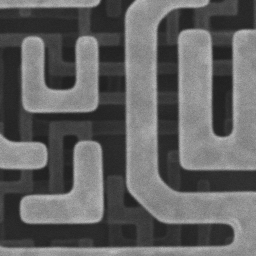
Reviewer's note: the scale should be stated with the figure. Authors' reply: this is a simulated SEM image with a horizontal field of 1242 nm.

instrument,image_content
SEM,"wiring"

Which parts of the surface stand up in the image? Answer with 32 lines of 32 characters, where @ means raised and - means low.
@@@@@@@@@@@@-----@@@@@@@@@------
----------------@@@@@-----------
----------------@@@@------------
----------------@@@@------------
----------------@@@@--@@@@---@@@
---@@-----@@----@@@@--@@@@---@@@
---@@----@@@----@@@@--@@@@---@@@
---@@-----@@----@@@@--@@@@---@@@
---@@-----@@----@@@@--@@@@---@@@
---@@-----@@----@@@@--@@@@---@@@
---@@@---@@@----@@@@--@@@@---@@@
---@@@@@@@@@----@@@@--@@@@---@@@
---@@@@@@@@@----@@@@--@@@@---@@@
---@@@@@@@@@----@@@@--@@@@---@@@
----------------@@@@--@@@@---@@@
----------------@@@@--@@@@---@@@
----------------@@@@--@@@@@--@@@
@---------------@@@@--@@@@@@@@@@
@@@@@@---@@@@---@@@@--@@@@@@@@@@
@@@@@@---@@@@---@@@@--@@@@@@@@@@
@@@@@@---@@@@---@@@@---@@@@@@@@@
---------@@@@---@@@@------------
---------@@@@---@@@@------------
---------@@@@---@@@@@-----------
---@@@@@@@@@@----@@@@@@@@@@@@@@@
---@@@@@@@@@@-----@@@@@@@@@@@@@@
---@@@@@@@@@@------@@@@@@@@@@@@@
---@@@@@@@@@--------@@@@@@@@@@@@
-----------------------------@@@
-----------------------------@@@
-----------------------------@@@
@@@@@@@@@@@@@@@@@@@@@@@@@@@@@@@@